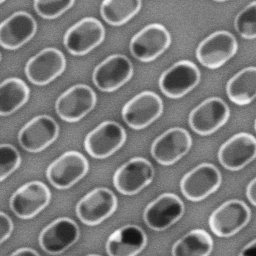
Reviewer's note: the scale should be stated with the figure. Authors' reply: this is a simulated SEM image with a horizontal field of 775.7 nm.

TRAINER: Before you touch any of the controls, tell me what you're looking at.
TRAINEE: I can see a regular array of raised bodies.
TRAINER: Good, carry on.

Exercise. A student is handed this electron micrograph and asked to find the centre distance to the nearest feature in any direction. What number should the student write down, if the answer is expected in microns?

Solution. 0.141